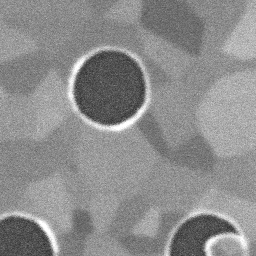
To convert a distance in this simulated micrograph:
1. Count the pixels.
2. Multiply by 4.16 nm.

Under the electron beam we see holes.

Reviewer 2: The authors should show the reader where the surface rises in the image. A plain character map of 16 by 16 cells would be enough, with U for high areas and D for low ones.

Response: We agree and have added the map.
UUUUUUUUUUUUUUUU
UUUUUUUUUUUUUUUU
UUUUUUUUUUUUUUUU
UUUUUUDDUUUUUUUU
UUUUUDDDDUUUUUUU
UUUUUDDDDUUUUUUU
UUUUUDDDDUUUUUUU
UUUUUUDDUUUUUUUU
UUUUUUUUUUUUUUUU
UUUUUUUUUUUUUUUU
UUUUUUUUUUUUUUUU
UUUUUUUUUUUUUUUU
UUUUUUUUUUUUUUUU
UUUUUUUUUUUUDDUU
DDDUUUUUUUUDDDDU
DDDUUUUUUUUDDUUU